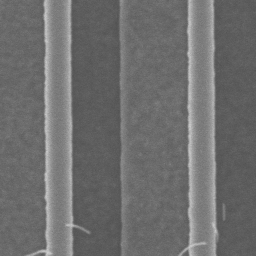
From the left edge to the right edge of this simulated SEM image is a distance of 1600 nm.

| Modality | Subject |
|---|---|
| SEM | lines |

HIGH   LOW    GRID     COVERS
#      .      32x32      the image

#########......############.....
#########......############.....
#########......############.....
#########......############.....
#########......############.....
#########......############.....
#########......############.....
#########......############.....
#########......############.....
#########......############.....
#########......############.....
#########......############.....
#########......############.....
#########......############.....
#########......############.....
#########......############.....
#########......############.....
#########......############.....
#########......############.....
#########......############.....
#########......############.....
#########......############.....
#########......############.....
#########......############.....
#########......############.....
#########......############.....
#########......############.....
#########......############.....
#########......############.....
#########......############.....
#########......############.....
#########......############.....